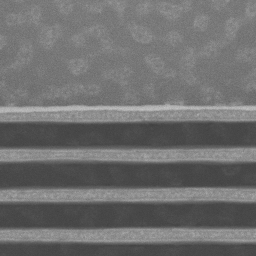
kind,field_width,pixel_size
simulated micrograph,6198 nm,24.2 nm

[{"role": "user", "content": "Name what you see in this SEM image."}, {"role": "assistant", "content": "parallel lines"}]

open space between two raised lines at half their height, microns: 0.636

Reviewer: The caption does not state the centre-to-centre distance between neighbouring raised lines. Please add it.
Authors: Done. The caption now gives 972 nanometres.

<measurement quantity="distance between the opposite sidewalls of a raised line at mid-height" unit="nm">348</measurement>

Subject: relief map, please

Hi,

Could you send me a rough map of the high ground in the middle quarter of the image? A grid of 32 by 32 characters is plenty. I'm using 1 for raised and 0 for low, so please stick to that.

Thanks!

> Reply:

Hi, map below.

00000000000000000000000000000000
00000000000000000000000000000000
00000000000000000000000000000000
00000000000000000000000000000000
00000000000000000000000000000000
00000000000000000000000000000000
00000000000000000000000000000000
00000000000000000000000000000000
00000000000000000000000000000000
00000000000000000000000000000000
00000000000000000000000000000000
11111111111111111111111111111111
11111111111111111111111111111111
11111111111111111111111111111111
11111111111100000100100000000000
00000000000000000000000000000000
00000000000000000000000000000000
00000000000000000000000000000000
00000000000000000000000000000000
00000000000000000000000000000000
00000000000000000000000000000000
11111111111111111111111111111111
11111111111111111111111111111111
11111111111111111111111111111111
00000000000000011111111111111110
00000000000000000000000000000000
00000000000000000000000000000000
00000000000000000000000000000000
00000000000000000000000000000000
00000000000000000000000000000000
00000000000000000000000000000000
11111111111111111111111111111111